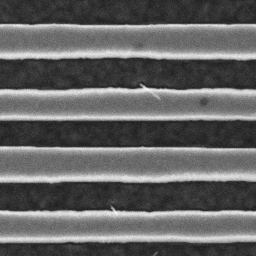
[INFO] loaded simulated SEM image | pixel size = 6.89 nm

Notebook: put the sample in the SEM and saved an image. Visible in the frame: lines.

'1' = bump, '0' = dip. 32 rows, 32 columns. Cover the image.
00000000000000000000000000000000
00000000000000000000000000000000
00000000000000000000000000000000
11111111111111111111111111111111
11111111111111111111111111111111
11111111111111111111111111111111
11111111111111111111111111111111
00000000000000000000000000000000
00000000000000000000000000000000
00000000000000000000000000000000
00000000000000000000000000000000
11111111111111111111111111111111
11111111111111111111111111111111
11111111111111111111111111111111
11111111111111111111111111111111
00000000000000000000000000000000
00000000000000000000000000000000
00000000000000000000000000000000
11111111111111111111111111000000
11111111111111111111111111111111
11111111111111111111111111111111
11111111111111111111111111111111
11111111111111111111111111111011
00000000000000000000000000000000
00000000000000000000000000000000
00000000000000000000000000000000
11111111111111111111111111111111
11111111111111111111111111111111
11111111111111111111111111111111
11111111111111111111111111111111
00000000000000000000000000000000
00000000000000000000000000000000